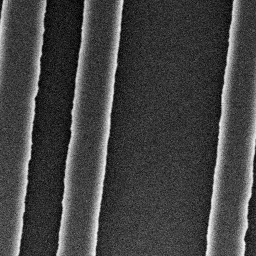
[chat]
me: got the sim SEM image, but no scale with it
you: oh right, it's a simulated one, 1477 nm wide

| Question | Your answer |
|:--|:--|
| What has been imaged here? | lines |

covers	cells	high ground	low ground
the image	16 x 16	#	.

###..###.......#
###..###......##
###..##.......##
###..##.......##
##...##.......##
##...##.......##
##...##.......##
##..###.......##
##..###.......##
##..###.......##
##..###......###
##..##.......###
##..##.......###
#...##.......##.
#...##.......##.
#...##.......##.